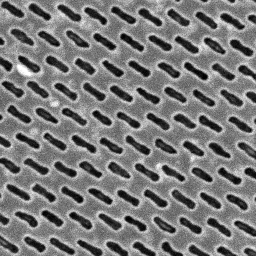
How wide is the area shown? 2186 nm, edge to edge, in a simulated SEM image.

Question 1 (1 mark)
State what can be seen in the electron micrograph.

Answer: a regular array of holes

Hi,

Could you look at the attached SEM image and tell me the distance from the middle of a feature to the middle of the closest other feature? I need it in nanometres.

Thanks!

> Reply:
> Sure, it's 226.